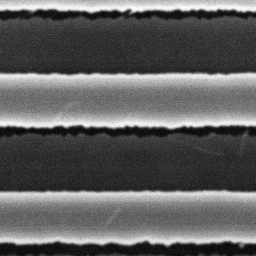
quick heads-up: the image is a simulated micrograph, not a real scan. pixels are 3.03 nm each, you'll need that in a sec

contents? lines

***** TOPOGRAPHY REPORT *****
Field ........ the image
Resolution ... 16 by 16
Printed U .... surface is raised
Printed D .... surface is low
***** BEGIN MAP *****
UUUUUUUUUUUUUUUU
DDDDDDDDDDDDDDDD
DDDDDDDDDDDDDDDD
DDDDDDDDDDDDDDDD
DDDDDDDDDDDDDDDD
UUUUUUUUUUUUUUUU
UUUUUUUUUUUUUUUU
UUUUUUUUUUUUUUUU
DDDDDDDDDDDDDDDD
DDDDDDDDDDDDDDDD
DDDDDDDDDDDDDDDD
DDDDDDDDDDDDDDDD
UUUUUUUUUUUUUUUU
UUUUUUUUUUUUUUUU
UUUUUUUUUUUUUUUU
DDDDDDDDDDDDDDDD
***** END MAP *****